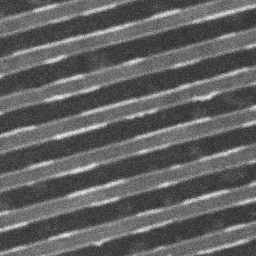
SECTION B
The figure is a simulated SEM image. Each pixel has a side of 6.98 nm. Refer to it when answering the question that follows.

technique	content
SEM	parallel lines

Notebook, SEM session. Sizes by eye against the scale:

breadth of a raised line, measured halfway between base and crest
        0.171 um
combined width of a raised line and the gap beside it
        0.261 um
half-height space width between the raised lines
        91.7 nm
